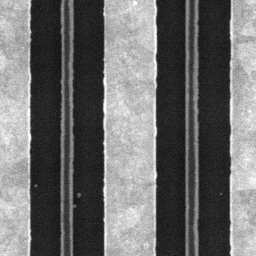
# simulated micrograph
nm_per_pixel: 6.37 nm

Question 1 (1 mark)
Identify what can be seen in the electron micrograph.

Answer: lines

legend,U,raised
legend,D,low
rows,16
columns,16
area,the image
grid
UUDDDDDUUUDDDDUU
UUDDDDDUUUDDDDUU
UUDDDDDUUUDDDDUU
UUDDDDDUUUDDDDUU
UUDDDDDUUUDDDDUU
UUDDDDDUUUDDDDUU
UUDDDDDUUUDDDDUU
UUDDDDDUUUDDDDUU
UUDDDDDUUUDDDDUU
UUDDDDDUUUDDDDUU
UUDDDDDUUUDDDDUU
UUDDDDDUUUDDDDUU
UUDDDDDUUUDDDDUU
UUDDDDDUUUDDDDUU
UUDDDDDUUUDDDDUU
UUDDDDDUUUDDDDUU